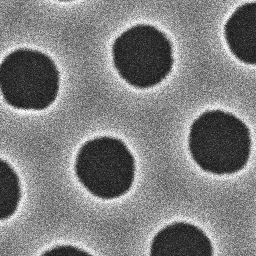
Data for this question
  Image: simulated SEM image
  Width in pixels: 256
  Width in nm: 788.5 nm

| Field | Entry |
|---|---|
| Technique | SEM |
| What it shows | holes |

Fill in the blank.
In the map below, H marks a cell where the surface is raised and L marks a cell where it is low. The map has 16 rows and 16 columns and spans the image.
HHHHHHHHHHHHHHHL
HHHHHHHHHHHHHHLL
HHHHHHHLLLLHHHLL
LLLHHHHLLLLHHHHL
LLLLHHHLLLLHHHHH
LLLLHHHHHHHHHHHH
HLLHHHHHHHHHHHHH
HHHHHHHHHHHHLLLH
HHHHHHHHHHHHLLLL
HHHHHLLLHHHHLLLL
LHHHHLLLHHHHHLLH
LHHHHLLLHHHHHHHH
LHHHHHHHHHHHHHHH
LHHHHHHHHHHHHHHH
HHHHHHHHHHLLLHHH
HHHLLHHHHLLLLHHH